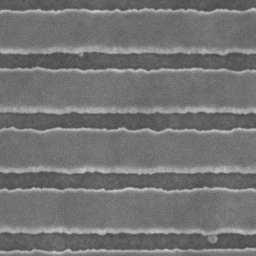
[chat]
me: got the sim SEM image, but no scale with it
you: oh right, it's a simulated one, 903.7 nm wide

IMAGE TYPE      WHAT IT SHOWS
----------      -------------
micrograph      lines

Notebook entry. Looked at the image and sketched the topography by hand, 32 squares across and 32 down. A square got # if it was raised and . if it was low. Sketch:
................................
################################
################################
################################
################################
################################
#######.##...#####.##########.##
................................
....#...........................
################################
################################
################################
################################
################################
................................
................................
################################
################################
################################
################################
################################
..#.....##.....#.##...........#.
................................
....#...........#.#......###....
################################
################################
################################
################################
################################
................................
................................
#######.########################